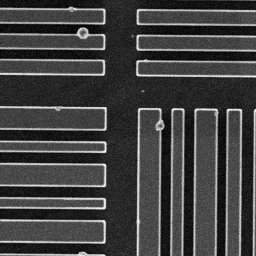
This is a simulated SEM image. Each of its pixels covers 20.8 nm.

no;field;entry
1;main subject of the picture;groups of lines, slits or small figures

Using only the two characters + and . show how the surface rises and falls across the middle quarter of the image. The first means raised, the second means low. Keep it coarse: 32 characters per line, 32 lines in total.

++++++++++........++++++++++++++
++++++++++........++++++++++++++
++++++++++........++++++++++++++
................................
................................
................................
................................
................................
................................
................................
................................
++++++++++.........+++++...+++..
++++++++++.........+++++...+++..
++++++++++.........+++++...+++..
++++++++++.........++++++..+++..
++++++++++.........++++++..+++..
...................+++++...+++..
...................+++++...+++..
...................+++++...+++..
++.................+++++...+++..
++++++++++.........+++++...+++..
++++++++++.........+++++...+++..
...................+++++...+++..
...................+++++...+++..
...................+++++...+++..
++++++++++.........+++++...+++..
++++++++++.........+++++...+++..
++++++++++.........+++++...+++..
++++++++++.........+++++...+++..
++++++++++.........+++++...+++..
++++++++++.........+++++...+++..
...................+++++...+++..